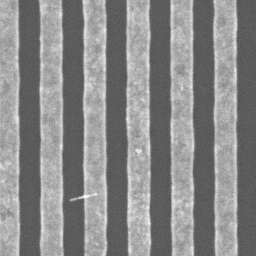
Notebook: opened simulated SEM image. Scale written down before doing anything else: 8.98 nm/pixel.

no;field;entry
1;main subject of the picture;wiring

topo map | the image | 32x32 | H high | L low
HHLLLHHHLLHHHLLLHHHLLHHHLLLHHLLL
HHLLLHHHLLHHHLLLHHHLLHHHLLLHHLLL
HHLLLHHHLLLHHLLLHHHLLHHHLLLHHHLL
HHLLLHHHLLLHHLLLHHHLLHHHLLLHHHLL
HHLLLHHHLLLHHLLLHHHLLHHHLLLHHLLL
HHLLLHHHLLLHHLLLHHHLLHHHLLLHHLLL
HHLLLHHHLLLHHLLLHHHLLHHHLLLHHLLL
HHLLLHHHLLLHHLLLHHHLLHHHLLLHHLLL
HHLLLHHHLLLHHLLLHHHLLHHHLLLHHLLL
HHLLLHHHLLLHHLLLHHHLLHHHLLLHHHLL
HHLLLHHHLLLHHLLLHHHLLHHHLLLHHLLL
HHLLLHHHLLLHHLLLHHHLLHHHLLLHHHLL
HHLLLHHHLLHHHLLLHHHLLHHHLLLHHHLL
HHLLLHHHLLHHHLLLHHHLLHHHLLLHHHLL
HHLLLHHHLLLHHLLLHHHLLHHHLLLHHHLL
HHLLLHHHLLLHHLLLHHHLLHHHLLLHHLLL
HHLLLHHHLLLHHLLLHHHLLHHHLLLHHLLL
HHLLLHHHLLLHHLLLHHHLLHHHLLLHHHLL
HHLLLHHHLLLHHLLLHHHLLHHHLLLHHHLL
HHLLLHHHLLLHHLLLHHHLLHHHLLLHHLLL
HHLLLHHHLLHHHLLLHHHLLHHHLLLHHHLL
HHLLLHHHLLLHHLLLHHHLLHHHLLLHHHLL
HHLLLHHHLLLHHLLLHHHLLHHHLLLHHHLL
HHLLLHHHLLLHHLLLHHHLLHHHLLLHHHLL
HHLLLHHHLLHHHLLLHHHLLHHHLLLHHHLL
HHLLLHHHLLLHHLLLHHHLLHHHLLLHHHLL
HHLLLHHHLLLHHLLLHHHLLHHHLLLHHHLL
HHLLLHHHLLLHHLLLHHHLLHHHLLLHHHLL
HHLLLHHHLLLHHLLLHHHLLHHHLLLHHHLL
HHLLLHHHLLLHHLLLHHHLLLHHLLLHHHLL
HHLLLHHHLLLHHLLLHHHLLLHHLLLHHHLL
HHLLLHHHLLLHHLLLHHHLLLHHLLLHHHLL